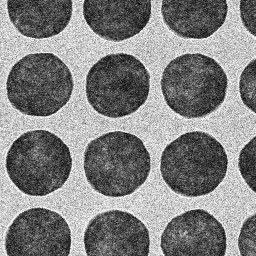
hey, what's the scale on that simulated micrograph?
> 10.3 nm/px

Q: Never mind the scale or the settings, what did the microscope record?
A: holes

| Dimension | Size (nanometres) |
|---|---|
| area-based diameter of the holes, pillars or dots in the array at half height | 678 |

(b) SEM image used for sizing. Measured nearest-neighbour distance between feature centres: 800 nm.